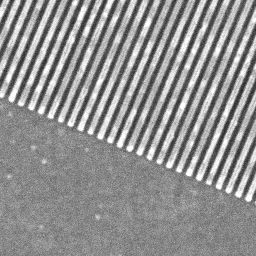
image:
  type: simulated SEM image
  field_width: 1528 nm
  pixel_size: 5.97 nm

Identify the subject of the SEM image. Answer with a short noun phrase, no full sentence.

parallel lines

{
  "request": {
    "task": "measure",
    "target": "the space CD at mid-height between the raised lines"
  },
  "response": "0.0351 micrometres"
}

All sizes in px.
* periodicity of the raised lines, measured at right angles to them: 10.7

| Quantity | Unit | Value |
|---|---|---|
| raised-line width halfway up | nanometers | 28.9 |